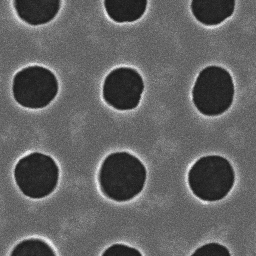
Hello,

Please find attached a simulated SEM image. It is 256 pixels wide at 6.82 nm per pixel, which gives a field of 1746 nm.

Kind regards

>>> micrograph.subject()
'holes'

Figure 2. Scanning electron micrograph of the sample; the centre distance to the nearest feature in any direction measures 0.594 micrometres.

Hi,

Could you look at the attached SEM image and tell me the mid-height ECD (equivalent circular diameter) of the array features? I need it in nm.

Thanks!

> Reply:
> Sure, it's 312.